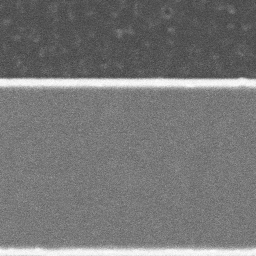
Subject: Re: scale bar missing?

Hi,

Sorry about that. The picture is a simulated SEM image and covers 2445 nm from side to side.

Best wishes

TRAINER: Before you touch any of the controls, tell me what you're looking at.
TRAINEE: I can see one or a few lines or trenches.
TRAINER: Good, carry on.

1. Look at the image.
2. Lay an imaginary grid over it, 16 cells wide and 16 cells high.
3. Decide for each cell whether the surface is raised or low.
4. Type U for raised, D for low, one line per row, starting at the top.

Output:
DDDDDDDDDDDDDDDD
DDDDDDDDDDDDDDDD
DDDDDDDDDDDDDDDD
DDDDDDDDDDDDDDDD
DDDDDDDDDDDDDDDD
UUUUUUUUUUUUUUUU
UUUUUUUUUUUUUUUU
UUUUUUUUUUUUUUUU
UUUUUUUUUUUUUUUU
UUUUUUUUUUUUUUUU
UUUUUUUUUUUUUUUU
UUUUUUUUUUUUUUUU
UUUUUUUUUUUUUUUU
UUUUUUUUUUUUUUUU
UUUUUUUUUUUUUUUU
UUUUUUUUUUUUUUUU